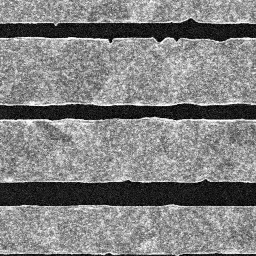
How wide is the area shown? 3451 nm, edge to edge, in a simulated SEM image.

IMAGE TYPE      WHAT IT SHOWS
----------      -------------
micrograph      one or a few lines or trenches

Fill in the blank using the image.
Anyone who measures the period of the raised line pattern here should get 1.07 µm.